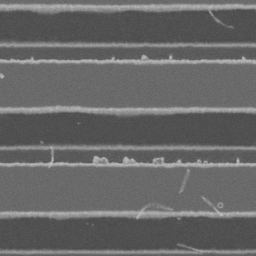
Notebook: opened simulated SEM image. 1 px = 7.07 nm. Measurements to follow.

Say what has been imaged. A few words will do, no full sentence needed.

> lines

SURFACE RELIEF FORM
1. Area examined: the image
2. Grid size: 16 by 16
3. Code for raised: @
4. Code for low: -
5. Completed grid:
----------------
----------------
----------------
@@@@@@@@@@@@@@@@
@@@@@@@@@@@@@@@@
@@@@@@@@@@@@@@@@
@@@@@@@@@@@@@@@@
----------------
----------------
@@@@@@@@@@@@@@@@
@@@@@@@@@@@@@@@@
@@@@@@@@@@@@@@@@
@@@@@@@@@@@@@@@@
----------------
----------------
----------------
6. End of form